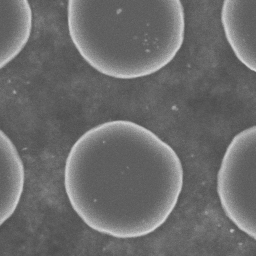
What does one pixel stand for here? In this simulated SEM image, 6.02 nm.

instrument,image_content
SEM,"raised bodies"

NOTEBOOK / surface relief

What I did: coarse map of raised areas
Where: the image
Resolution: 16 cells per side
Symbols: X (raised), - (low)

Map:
XX--XXXXXXX---XX
XX--XXXXXXX---XX
XX---XXXXXX---XX
X----XXXXXX----X
-------XX-------
----------------
----------------
----------------
-----XXXXX-----X
X---XXXXXXX---XX
X---XXXXXXX---XX
X---XXXXXXX---XX
X---XXXXXXX---XX
-----XXXXX----XX
-------XX-------
----------------